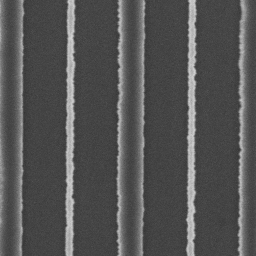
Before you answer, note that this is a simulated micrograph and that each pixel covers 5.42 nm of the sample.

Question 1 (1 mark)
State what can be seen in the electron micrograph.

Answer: lines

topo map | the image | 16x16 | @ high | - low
@------@@------@
@------@@------@
@------@@------@
@------@@------@
@------@@------@
@------@@------@
@------@@------@
@------@@------@
@------@@------@
@------@@------@
@------@@------@
@------@@------@
@------@@------@
@------@@------@
@------@@------@
@------@@------@